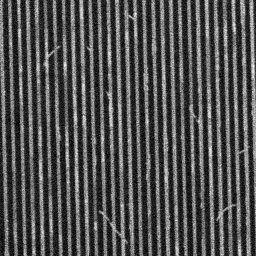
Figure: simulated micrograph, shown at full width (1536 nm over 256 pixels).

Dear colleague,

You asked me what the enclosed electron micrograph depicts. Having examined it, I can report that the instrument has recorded parallel lines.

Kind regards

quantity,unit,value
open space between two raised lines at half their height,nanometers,37.5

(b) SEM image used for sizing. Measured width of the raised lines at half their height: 0.0165 um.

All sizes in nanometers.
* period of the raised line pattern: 53.7